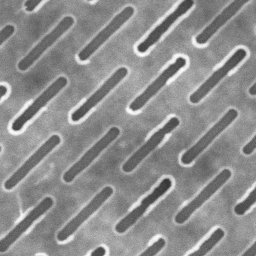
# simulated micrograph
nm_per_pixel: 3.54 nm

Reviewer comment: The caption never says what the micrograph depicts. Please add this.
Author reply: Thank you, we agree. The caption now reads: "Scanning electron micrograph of a regular array of holes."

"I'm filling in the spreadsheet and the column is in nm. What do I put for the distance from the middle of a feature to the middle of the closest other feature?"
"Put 210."